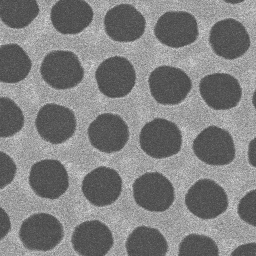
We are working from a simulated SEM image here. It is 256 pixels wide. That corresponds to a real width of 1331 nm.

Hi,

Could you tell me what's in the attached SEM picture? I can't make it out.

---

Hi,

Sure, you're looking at a regular array of holes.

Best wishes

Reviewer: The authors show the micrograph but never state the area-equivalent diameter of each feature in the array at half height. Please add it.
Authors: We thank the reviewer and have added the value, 210 nm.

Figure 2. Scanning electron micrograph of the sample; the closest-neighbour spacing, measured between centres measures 274 nm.